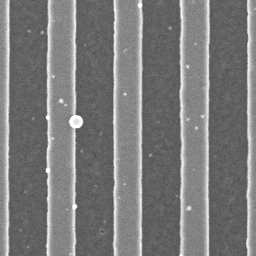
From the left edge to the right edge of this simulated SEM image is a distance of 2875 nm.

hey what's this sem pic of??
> lines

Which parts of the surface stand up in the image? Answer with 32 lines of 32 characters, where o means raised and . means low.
o.....ooo.....oooo.....ooo.....o
o.....ooo.....oooo.....ooo.....o
o.....ooo.....oooo.....ooo.....o
o.....ooo.....oooo.....ooo.....o
o.....ooo.....oooo.....ooo.....o
o.....ooo.....oooo.....ooo.....o
o.....ooo.....oooo.....ooo.....o
o.....ooo.....oooo.....ooo.....o
o.....ooo.....oooo.....ooo.....o
o.....ooo.....oooo.....ooo.....o
o.....ooo.....oooo.....ooo.....o
o.....ooo.....oooo.....ooo.....o
o.....ooo.....oooo.....ooo.....o
o.....ooo.....oooo.....ooo.....o
o.....oooo....oooo.....ooo.....o
o.....oooo....oooo.....ooo.....o
o.....ooo.....oooo.....ooo.....o
o.....ooo.....oooo.....ooo.....o
o.....ooo.....oooo.....ooo.....o
o.....ooo.....oooo.....ooo.....o
o.....ooo.....oooo.....ooo.....o
o.....ooo.....oooo.....ooo.....o
o.....ooo.....oooo.....ooo.....o
o.....ooo.....oooo.....ooo.....o
o.....ooo.....oooo.....ooo.....o
o.....ooo.....oooo.....ooo.....o
o.....ooo.....oooo.....ooo.....o
o.....ooo.....oooo.....ooo.....o
o.....ooo.....oooo.....ooo.....o
o.....ooo.....oooo.....ooo.....o
o.....ooo.....oooo.....ooo.....o
o.....ooo.....oooo.....ooo.....o